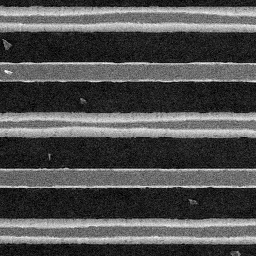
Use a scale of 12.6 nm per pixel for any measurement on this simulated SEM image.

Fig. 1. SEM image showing lines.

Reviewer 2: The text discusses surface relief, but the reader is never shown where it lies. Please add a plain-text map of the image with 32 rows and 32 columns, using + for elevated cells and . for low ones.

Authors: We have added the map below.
................................
++++++++++++++++++++++++++++++++
++++++++++++++++++++++++++++++++
++++++++++++++++++++++++++++++++
................................
................................
................................
................................
++++++++++++++++++++++++++++++++
++++++++++++++++++++++++++++++++
................................
................................
................................
................................
...+++++..............++++++++.+
++++++++++++++++++++++++++++++++
++++++++++++++++++++++++++++++++
................................
................................
................................
................................
++++++++++++++++++++++++++++++++
++++++++++++++++++++++++++++++++
................................
................................
................................
................................
................................
++++++++++++++++++++++++++++++++
++++++++++++++++++++++++++++++++
................................
................................